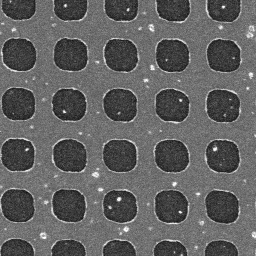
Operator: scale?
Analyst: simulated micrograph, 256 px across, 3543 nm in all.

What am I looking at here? a regular array of holes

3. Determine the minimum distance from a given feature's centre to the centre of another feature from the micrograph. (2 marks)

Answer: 692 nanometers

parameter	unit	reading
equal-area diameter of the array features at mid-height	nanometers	484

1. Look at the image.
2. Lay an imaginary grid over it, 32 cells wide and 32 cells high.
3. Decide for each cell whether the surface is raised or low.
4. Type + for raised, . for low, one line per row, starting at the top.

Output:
....+++....++....+++....++....++
....+++....++....+++....++....++
++++++++..++++..+++++..++++..+++
++++++++++++++++++++++++++++++++
++++++++++++++++++++++++++++++++
+...+++....++....+++...+++....++
.....++....++....+++....++....++
.....++....++....+++....++....++
+...+++...++++...+++...+++....++
++++++++++++++++++++++++++++++++
++++++++++++++++++++++++++++++++
+...+++...++++..++++...+++...+++
....++.....++....++.....++....++
....+++....++....++.....++....++
+...+++...+++....+++...+++....++
++++++++++++++++++++++++++++++++
++++++++++++++++++++++++++++++++
+..+++++.+++++..+++++.+++++.++++
....+++....++....++....+++....++
....+++....++....++.....++....++
....+++....++....+++....++....++
++++++++..+++++.+++++..++++..+++
++++++++++++++++++++++++++++++++
++++++++++++++++++++++++++++++++
....+++...+++....+++...+++...+++
....++.....++....++....+++....++
....+++....++....++....+++....++
+...++++..++++..++++...++++..+++
++++++++++++++++++++++++++++++++
++++++++++++++++++++++++++++++++
....+++...+++...++++...+++...+++
....++.....++....++....+++....++